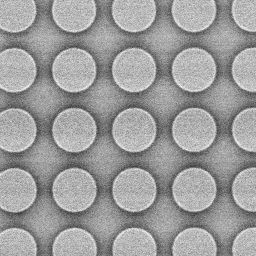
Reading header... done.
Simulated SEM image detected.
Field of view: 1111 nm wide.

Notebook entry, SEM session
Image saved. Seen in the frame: an array of small figures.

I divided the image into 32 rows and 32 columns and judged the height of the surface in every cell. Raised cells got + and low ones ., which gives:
++++...+++++..+++++...+++++..+++
++++...+++++..+++++...+++++..+++
++++...+++++..+++++...+++++..+++
+++.....+++....+++.....+++....++
................................
................................
+++.....+++....+++.....+++....++
++++...+++++..+++++...+++++..+++
++++...+++++..+++++...+++++..+++
++++...+++++..+++++...+++++..+++
++++...++++....++++...++++....++
................................
................................
................................
++++...++++....++++...++++....++
++++...+++++..+++++...+++++..+++
++++...+++++..+++++...+++++..+++
++++...+++++..+++++...+++++..+++
+++.....+++....+++.....+++....++
................................
................................
+++.....+++....+++.....+++....++
++++...+++++..+++++...+++++..+++
++++...+++++..+++++...+++++..+++
++++...+++++..+++++...+++++..+++
++++...++++....++++...++++....++
................................
................................
................................
++++...++++....++++...++++....++
++++...+++++..+++++...+++++..+++
++++...+++++..+++++...+++++..+++